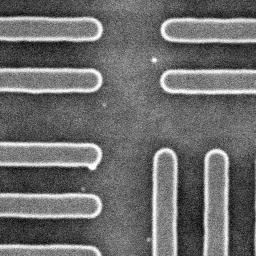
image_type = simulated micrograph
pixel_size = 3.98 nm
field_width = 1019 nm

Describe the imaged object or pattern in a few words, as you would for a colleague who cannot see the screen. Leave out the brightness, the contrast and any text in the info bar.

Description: groups of lines, slits or small figures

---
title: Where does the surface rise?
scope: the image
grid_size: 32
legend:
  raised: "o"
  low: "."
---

................................
................................
oooooooooooo.........ooooooooooo
ooooooooooooo.......oooooooooooo
oooooooooooo........oooooooooooo
................................
................................
................................
................................
oooooooooooo........oooooooooooo
ooooooooooooo.......oooooooooooo
...ooo...............ooooooooooo
................................
................................
................................
................................
................................
................................
oooooooooooo....................
ooooooooooooo......ooo....oo....
oooooooooooo.......ooo....oo....
...................ooo....oo....
...................ooo....oo....
...................ooo....oo....
oooooooooooo.......ooo....oo....
ooooooooooooo......ooo....oo....
oooooooooooo.......ooo....oo....
...................ooo....oo....
...................ooo....oo....
...................ooo....oo....
...................ooo....oo....
oooooooooooo.......ooo....oo....